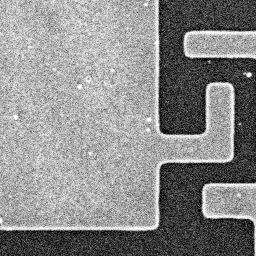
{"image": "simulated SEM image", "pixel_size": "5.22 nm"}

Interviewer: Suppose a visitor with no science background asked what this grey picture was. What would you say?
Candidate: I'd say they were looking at wiring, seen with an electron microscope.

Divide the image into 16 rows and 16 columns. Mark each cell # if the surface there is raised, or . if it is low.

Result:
##########......
##########......
##########..####
##########..####
##########......
##########...#..
##########...##.
##########...##.
###########.###.
###############.
##########......
##########......
##########...###
##########...###
................
................